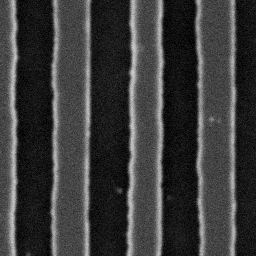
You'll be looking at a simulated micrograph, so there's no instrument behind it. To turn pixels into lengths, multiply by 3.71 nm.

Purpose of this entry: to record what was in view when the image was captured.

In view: lines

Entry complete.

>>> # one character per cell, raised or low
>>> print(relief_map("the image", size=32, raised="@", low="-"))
@@-----@@@@-----@@@@-----@@@@---
@@-----@@@@-----@@@@-----@@@@---
@@-----@@@@-----@@@@-----@@@@---
@@-----@@@@-----@@@@-----@@@@---
@@-----@@@@------@@@-----@@@@---
@@-----@@@@-----@@@@-----@@@@---
@@-----@@@@------@@@-----@@@@---
@@-----@@@@------@@@-----@@@@---
@@-----@@@@-----@@@@-----@@@@---
@@-----@@@@-----@@@@-----@@@@---
@@-----@@@@-----@@@@-----@@@@---
@@-----@@@@-----@@@@-----@@@@---
@@-----@@@@-----@@@@-----@@@@---
@@-----@@@@-----@@@@-----@@@@---
@@-----@@@@-----@@@@-----@@@@---
@@-----@@@@-----@@@@-----@@@@---
@@-----@@@@-----@@@@-----@@@@---
@@-----@@@@-----@@@@-----@@@@---
@@-----@@@@-----@@@@-----@@@@---
@@-----@@@@-----@@@@-----@@@@---
@@-----@@@@-----@@@@-----@@@@---
@@-----@@@@-----@@@@-----@@@@---
@@-----@@@@-----@@@@-----@@@@---
@@-----@@@@-----@@@@-----@@@@---
@@-----@@@@-----@@@@-----@@@@---
@@-----@@@@-----@@@@-----@@@@---
@@----@@@@@-----@@@@-----@@@@---
@@-----@@@@-----@@@@-----@@@@---
@@-----@@@@-----@@@@-----@@@@---
@@-----@@@@-----@@@@-----@@@@---
@@-----@@@@-----@@@@-----@@@@---
@@-----@@@@-----@@@@-----@@@@---